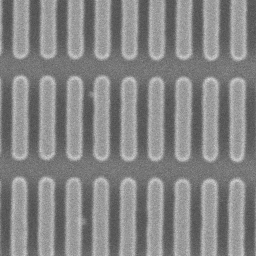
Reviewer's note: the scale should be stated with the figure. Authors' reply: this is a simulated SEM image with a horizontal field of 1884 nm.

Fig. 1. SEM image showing groups of lines, slits or small figures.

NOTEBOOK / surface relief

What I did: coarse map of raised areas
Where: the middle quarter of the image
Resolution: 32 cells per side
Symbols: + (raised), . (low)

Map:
................................
................................
................................
..+......++.....................
.+++....+++....+++....+++...+++.
.++++...+++....+++....+++...++++
.++++...+++....+++...++++...++++
.++++...+++....+++...++++...++++
.+++....+++....+++...++++...++++
.+++....+++....+++...++++...++++
.+++....+++....+++...++++...+++.
.+++....+++....+++...++++...++++
.+++....+++....+++...++++...++++
.+++....+++....+++...++++...++++
.+++....+++....+++...++++...+++.
.+++....+++....+++...++++...+++.
.+++....+++....+++...++++...+++.
.+++....+++....+++...++++...+++.
.+++....+++....+++...++++...+++.
.+++....+++...++++...++++...+++.
.+++....+++...++++...++++...+++.
.+++....+++...++++...++++...+++.
.+++....+++...++++...++++...+++.
..++....+++....++.....++....+++.
................................
................................
................................
................................
................................
.+++....+++....+++....++....+++.
.+++....+++...++++...++++...+++.
.+++....+++...++++...++++...+++.